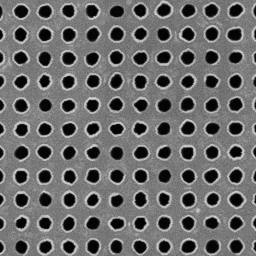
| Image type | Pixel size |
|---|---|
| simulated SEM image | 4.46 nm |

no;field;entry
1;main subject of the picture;a regular array of holes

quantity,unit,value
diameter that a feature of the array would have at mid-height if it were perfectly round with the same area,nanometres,51.3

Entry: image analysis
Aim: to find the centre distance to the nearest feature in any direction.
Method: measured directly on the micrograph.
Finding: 104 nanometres